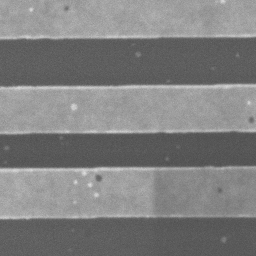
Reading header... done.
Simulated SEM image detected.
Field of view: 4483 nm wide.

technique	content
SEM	lines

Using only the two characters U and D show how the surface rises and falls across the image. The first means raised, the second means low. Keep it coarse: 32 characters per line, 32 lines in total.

UUUUUUUUUUUUUUUUUUUUUUUUUUUUUUUU
UUUUUUUUUUUUUUUUUUUUUUUUUUUUUUUU
UUUUUUUUUUUUUUUUUUUUUUUUUUUUUUUU
UUUUUUUUUUUUUUUUUUUUUUUUUUUUUUUU
UUUUUUUUUUUUUUUUUUUUUUUUUUUUUUUU
DDDDDDDDDDDDDDDDDDDDDDDDDDDDDDDD
DDDDDDDDDDDDDDDDDDDDDDDDDDDDDDDD
DDDDDDDDDDDDDDDDDDDDDDDDDDDDDDDD
DDDDDDDDDDDDDDDDDDDDDDDDDDDDDDDD
DDDDDDDDDDDDDDDDDDDDDDDDDDDDDDDD
DDDDDDDDDDDDDDDDDDDDDDDDDDDDDDDD
UUUUUUUUUUUUUUUUUUUUUUUUUUUUUUUU
UUUUUUUUUUUUUUUUUUUUUUUUUUUUUUUU
UUUUUUUUUUUUUUUUUUUUUUUUUUUUUUUU
UUUUUUUUUUUUUUUUUUUUUUUUUUUUUUUU
UUUUUUUUUUUUUUUUUUUUUUUUUUUUUUUU
UUUUUUUUUUUUUUUUUUUDDUDDDDDDDDDD
DDDDDDDDDDDDDDDDDDDDDDDDDDDDDDDD
DDDDDDDDDDDDDDDDDDDDDDDDDDDDDDDD
DDDDDDDDDDDDDDDDDDDDDDDDDDDDDDDD
DDDDDDDDDDDDDDDDDDDDDDDDDDDDDDDD
UUUUUUUUUUUUUUUUUUUUUUUUUUUUUUUU
UUUUUUUUUUUUUUUUUUUUUUUUUUUUUUUU
UUUUUUUUUUUUUUUUUUUUUUUUUUUUUUUU
UUUUUUUUUUUUUUUUUUUUUUUUUUUUUUUU
UUUUUUUUUUUUUUUUUUUUUUUUUUUUUUUU
UUUUUUUUUUUUUUUUUUUUUUUUUUUUUUUU
DDDDDDDDDDDDDDDDDDDDDDDDDDDDDDDD
DDDDDDDDDDDDDDDDDDDDDDDDDDDDDDDD
DDDDDDDDDDDDDDDDDDDDDDDDDDDDDDDD
DDDDDDDDDDDDDDDDDDDDDDDDDDDDDDDD
DDDDDDDDDDDDDDDDDDDDDDDDDDDDDDDD